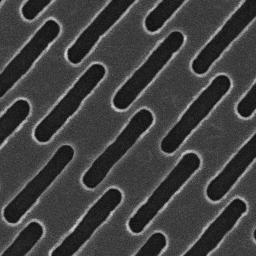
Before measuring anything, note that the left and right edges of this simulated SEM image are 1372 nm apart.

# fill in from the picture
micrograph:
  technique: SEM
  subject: holes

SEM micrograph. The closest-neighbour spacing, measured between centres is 0.344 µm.